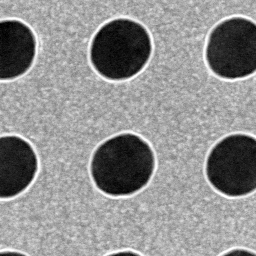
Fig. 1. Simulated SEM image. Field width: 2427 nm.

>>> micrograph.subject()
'holes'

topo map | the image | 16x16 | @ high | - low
@@@@@@@@@@@@@@@@
-@@@@@@--@@@@@--
--@@@@---@@@@---
--@@@@---@@@@---
--@@@@---@@@@---
@@@@@@@@@@@@@@@@
@@@@@@@@@@@@@@@@
@@@@@@@@@@@@@@@@
@@@@@@@-@@@@@@-@
--@@@@----@@@---
--@@@@----@@@---
--@@@@---@@@@---
@@@@@@@@@@@@@@@@
@@@@@@@@@@@@@@@@
@@@@@@@@@@@@@@@@
@@@@@@@@@@@@@@@@